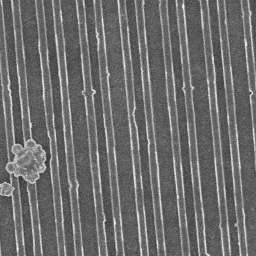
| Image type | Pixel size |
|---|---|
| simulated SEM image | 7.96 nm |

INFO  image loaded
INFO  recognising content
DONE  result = parallel lines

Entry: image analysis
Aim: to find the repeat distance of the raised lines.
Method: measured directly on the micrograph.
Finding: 162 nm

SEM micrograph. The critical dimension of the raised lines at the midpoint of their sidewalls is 60.4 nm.